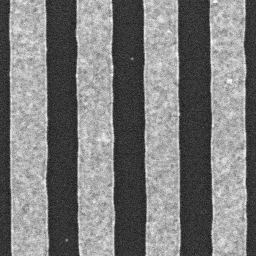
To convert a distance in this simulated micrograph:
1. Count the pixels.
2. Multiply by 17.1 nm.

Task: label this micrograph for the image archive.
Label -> wiring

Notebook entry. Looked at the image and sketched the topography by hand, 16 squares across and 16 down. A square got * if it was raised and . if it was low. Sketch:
.**..**..**..**.
.**..**..**..**.
.**..**..**..**.
.**..**..**..**.
.**..**..**..**.
.**..**..**..**.
.**..**..**..**.
.**..**..**..**.
.**..**..**..**.
.**..**..**..**.
.**..**..**..**.
.**..**..**..**.
.**..**..**..**.
.**..**..**..**.
.**..**..**..**.
.**..**..**..**.